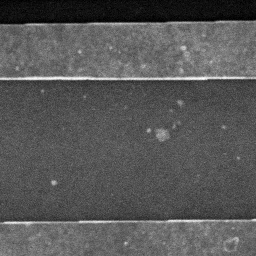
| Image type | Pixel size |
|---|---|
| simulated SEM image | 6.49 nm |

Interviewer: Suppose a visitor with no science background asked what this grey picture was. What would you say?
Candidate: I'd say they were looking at lines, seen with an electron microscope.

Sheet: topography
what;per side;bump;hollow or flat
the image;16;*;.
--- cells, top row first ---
................
.....***********
****************
****************
****************
................
................
................
................
................
................
................
................
................
****************
****************